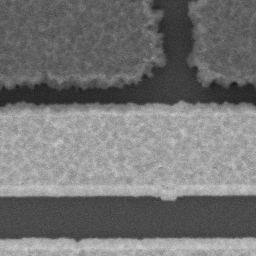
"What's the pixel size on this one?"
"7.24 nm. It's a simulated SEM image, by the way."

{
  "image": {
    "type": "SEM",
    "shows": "one or a few lines or trenches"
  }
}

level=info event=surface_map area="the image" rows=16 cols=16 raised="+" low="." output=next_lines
+++++++++...++++
++++++++++..++++
++++++++++..++++
++++++++++..++++
+++++++++...++++
................
................
++++++++++++++++
++++++++++++++++
++++++++++++++++
++++++++++++++++
++++++++++++++++
................
................
................
++++++++++++++++